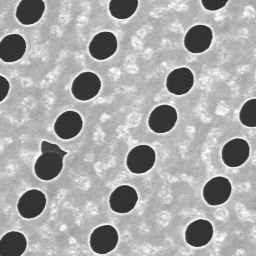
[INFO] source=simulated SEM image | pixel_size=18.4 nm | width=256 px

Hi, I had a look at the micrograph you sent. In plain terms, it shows a regular array of holes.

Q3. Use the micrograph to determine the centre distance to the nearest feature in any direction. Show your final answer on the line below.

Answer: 798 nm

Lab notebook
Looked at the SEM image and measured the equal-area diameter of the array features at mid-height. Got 533 nm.